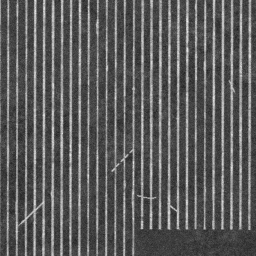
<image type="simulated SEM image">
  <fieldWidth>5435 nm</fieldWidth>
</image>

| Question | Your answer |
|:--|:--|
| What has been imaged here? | parallel lines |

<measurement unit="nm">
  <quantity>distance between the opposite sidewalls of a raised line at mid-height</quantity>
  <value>29.2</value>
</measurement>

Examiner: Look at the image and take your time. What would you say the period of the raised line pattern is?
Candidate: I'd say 8.95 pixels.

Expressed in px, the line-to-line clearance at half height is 7.13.